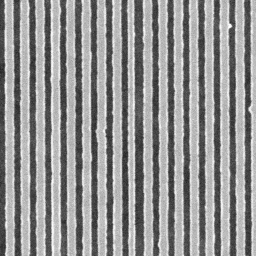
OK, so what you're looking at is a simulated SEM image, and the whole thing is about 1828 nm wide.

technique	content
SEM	parallel lines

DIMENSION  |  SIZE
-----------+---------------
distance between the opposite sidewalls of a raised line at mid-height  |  56.2 nm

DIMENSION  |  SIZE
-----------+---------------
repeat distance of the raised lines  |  110 nm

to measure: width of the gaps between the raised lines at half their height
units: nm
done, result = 56.2